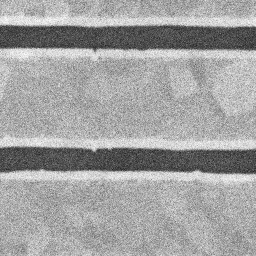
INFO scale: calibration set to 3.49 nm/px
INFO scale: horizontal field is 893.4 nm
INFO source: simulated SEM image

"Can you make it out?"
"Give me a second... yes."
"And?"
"one or a few lines or trenches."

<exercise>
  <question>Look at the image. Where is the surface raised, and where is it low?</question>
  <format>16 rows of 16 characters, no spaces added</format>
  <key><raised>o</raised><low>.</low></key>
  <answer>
oooooooooooooooo
................
................
oooooooooooooooo
oooooooooooooooo
oooooooooooooooo
oooooooooooooooo
oooooooooooooooo
oooooooooooooooo
................
................
oooooooooooooooo
oooooooooooooooo
oooooooooooooooo
oooooooooooooooo
oooooooooooooooo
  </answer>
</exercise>